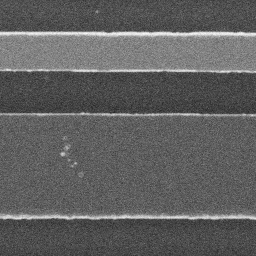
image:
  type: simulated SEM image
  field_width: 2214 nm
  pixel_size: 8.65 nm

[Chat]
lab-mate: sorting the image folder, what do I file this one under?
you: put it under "lines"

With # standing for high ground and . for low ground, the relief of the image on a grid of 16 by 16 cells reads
................
................
################
################
................
................
................
################
################
################
################
################
################
################
................
................